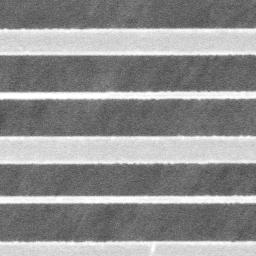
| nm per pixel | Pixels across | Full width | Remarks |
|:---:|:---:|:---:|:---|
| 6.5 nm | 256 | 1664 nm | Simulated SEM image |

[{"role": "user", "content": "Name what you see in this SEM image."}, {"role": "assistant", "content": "lines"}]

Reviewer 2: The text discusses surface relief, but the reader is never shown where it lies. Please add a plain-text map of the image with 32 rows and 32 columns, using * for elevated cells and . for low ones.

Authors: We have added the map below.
................................
................................
................................
................................
********************************
********************************
********************************
................................
................................
................................
................................
................................
................................
................................
................................
................................
................................
********************************
********************************
********************************
................................
................................
................................
................................
................................
................................
................................
................................
................................
................................
********************************
********************************